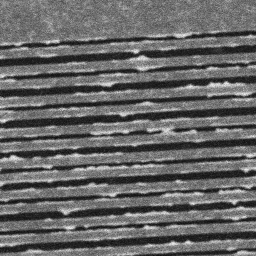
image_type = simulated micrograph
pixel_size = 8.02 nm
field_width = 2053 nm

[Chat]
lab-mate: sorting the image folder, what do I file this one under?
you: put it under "parallel lines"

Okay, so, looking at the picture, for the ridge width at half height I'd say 0.0751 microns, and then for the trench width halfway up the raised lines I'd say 49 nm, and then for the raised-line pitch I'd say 125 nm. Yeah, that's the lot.